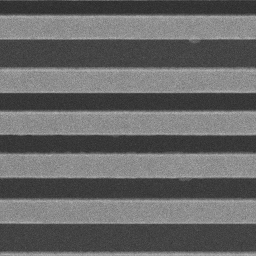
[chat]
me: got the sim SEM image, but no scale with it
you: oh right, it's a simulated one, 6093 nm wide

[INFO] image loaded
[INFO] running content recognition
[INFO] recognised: lines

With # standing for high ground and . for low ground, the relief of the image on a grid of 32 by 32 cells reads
................................
................................
################################
################################
################################
................................
................................
................................
................................
################################
################################
################################
................................
................................
################################
################################
################################
................................
................................
################################
################################
################################
................................
................................
................................
################################
################################
################################
................................
................................
................................
................................